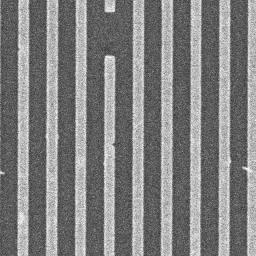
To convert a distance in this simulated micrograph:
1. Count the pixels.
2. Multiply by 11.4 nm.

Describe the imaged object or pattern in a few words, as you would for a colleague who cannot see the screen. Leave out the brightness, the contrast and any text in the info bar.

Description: parallel lines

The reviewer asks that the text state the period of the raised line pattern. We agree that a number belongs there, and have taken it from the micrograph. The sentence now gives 328 nanometres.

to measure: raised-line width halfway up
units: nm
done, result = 116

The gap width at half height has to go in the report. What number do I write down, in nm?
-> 213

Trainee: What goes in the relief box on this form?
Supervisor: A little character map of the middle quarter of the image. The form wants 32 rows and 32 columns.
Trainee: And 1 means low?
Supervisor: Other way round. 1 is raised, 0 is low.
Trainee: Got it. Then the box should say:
00011000001110000111000001100000
00011000001110000111000001100000
00011000001110000111000001100000
00011000001110000111000001100000
00011000001110000111000001100000
00011000001110000111000001100000
00011000001110000111000001100000
00011000001110000111000001100000
00011000001110000111000001100000
00011000001110000111000001100000
00011000001110000111000001100000
00011000001110000111000001100000
00011000001100000111000001100000
00011000001100000111000001100000
00011000001100000111000001100000
00011000001100000111000001100000
00011000001100000111000001100000
00011000001100000111000001100000
00011000001100000111000001100000
00011000001100000111000001100000
00011000001100000111000001100000
00011000001100000111000001100000
00011000001100000111000001100000
00011000001100000111000001100000
00011000001100000111000001100000
00011000001100000111000001100000
00011000001100000111000001100000
00011000001100000111000001100000
00011000001100000111000001100000
00011000001100000111000001100000
00011000001100000111000001100000
00011000001100000111000001100000